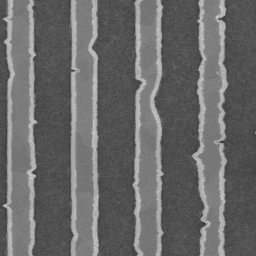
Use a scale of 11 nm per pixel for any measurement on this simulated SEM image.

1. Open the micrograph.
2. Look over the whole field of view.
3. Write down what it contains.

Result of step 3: one or a few lines or trenches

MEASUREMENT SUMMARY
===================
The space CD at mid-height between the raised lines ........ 0.464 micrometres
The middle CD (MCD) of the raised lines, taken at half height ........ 237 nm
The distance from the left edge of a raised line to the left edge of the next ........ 702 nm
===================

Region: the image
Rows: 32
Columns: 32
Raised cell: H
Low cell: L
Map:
LHHHLLLLLHHHLLLLLHHHLLLLLHHHLLLL
LHHHLLLLLHHHLLLLLHHHLLLLLHHHLLLL
LHHHLLLLLHHHLLLLLHHHLLLLLHHLLLLL
LHHHLLLLLHHHLLLLLHHHLLLLLHHHLLLL
LHHHLLLLLHHHLLLLLHHHLLLLLHHHLLLL
LHHHLLLLLHHLLLLLLHHHLLLLLHHHLLLL
LHHHLLLLLHHHLLLLLHHHLLLLLHHHLLLL
LHHHLLLLLHHHLLLLLHHHLLLLLHHHLLLL
LHHHLLLLLHHHLLLLLHHHLLLLLHHHLLLL
LHHHLLLLLHHHLLLLLHHHLLLLLHHHLLLL
LHHHLLLLLHHHLLLLLLHHLLLLLHHHLLLL
LHHHLLLLLHHHLLLLLHHLLLLLLHHHLLLL
LHHHLLLLLHHHLLLLLHHLLLLLLHHHLLLL
LHHHLLLLLHHHLLLLLHHLLLLLLHHHLLLL
LHHHLLLLLHHHLLLLLHHHLLLLLHHHLLLL
LHHHLLLLLHHHLLLLLHHHLLLLLHHHLLLL
LHHHLLLLLHHHLLLLLHHHLLLLLHHHLLLL
LHHHLLLLLHHHLLLLLHHHLLLLLHHHLLLL
LHHHLLLLLHHHLLLLLHHHLLLLLHHHLLLL
LHHHLLLLLHHHLLLLLHHHLLLLHHHHLLLL
LHHHLLLLLHHHLLLLLHHHLLLLLHHHLLLL
LHHHLLLLLHHHLLLLLHHHLLLLLHHHLLLL
LHHHLLLLLHHHLLLLLHHHLLLLLHHHLLLL
LHHHLLLLLHHHLLLLLHHHLLLLLHHHLLLL
LHHHLLLLLHHHLLLLLHHHLLLLLHHHLLLL
LHHHLLLLLHHHLLLLLHHHLLLLLLHHLLLL
LHHHLLLLLHHHLLLLLHHHLLLLLLHHLLLL
LHHHLLLLLHHHLLLLLHHHLLLLLLHHLLLL
LHHHLLLLLHHHLLLLLHHHLLLLLLHHLLLL
LHHHLLLLLHHHLLLLLHHHLLLLLHHHLLLL
LHHHLLLLLHHHLLLLLHHHLLLLLHHHLLLL
LHHHLLLLLHHHLLLLLHHHLLLLLHHHLLLL